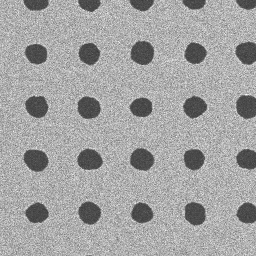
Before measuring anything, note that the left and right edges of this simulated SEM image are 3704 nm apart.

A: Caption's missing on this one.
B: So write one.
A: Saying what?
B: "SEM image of a regular array of holes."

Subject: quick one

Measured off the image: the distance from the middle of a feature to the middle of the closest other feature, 759 nm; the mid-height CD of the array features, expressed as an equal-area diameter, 326 nm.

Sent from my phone